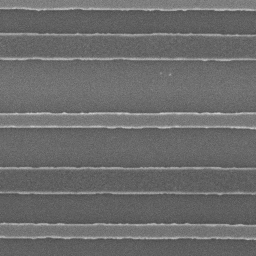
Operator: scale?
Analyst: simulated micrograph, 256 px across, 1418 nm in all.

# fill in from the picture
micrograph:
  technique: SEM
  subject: lines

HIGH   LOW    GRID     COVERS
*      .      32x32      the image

********************************
................................
................................
................................
********************************
********************************
********************************
.........................*.**...
................................
................................
................................
................................
................................
................................
********************************
********************************
................................
................................
................................
................................
................................
********************************
********************************
********************************
................................
................................
................................
................................
********************************
********************************
................................
................................